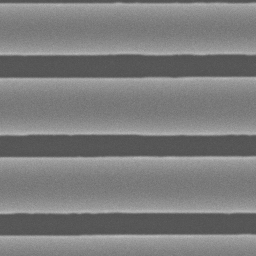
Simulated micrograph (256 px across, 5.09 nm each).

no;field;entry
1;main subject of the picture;lines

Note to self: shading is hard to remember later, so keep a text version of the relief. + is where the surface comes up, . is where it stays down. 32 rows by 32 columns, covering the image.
++++++++++++++++++++++++++++++++
++++++++++++++++++++++++++++++++
++++++++++++++++++++++++++++++++
++++++++++++++++++++++++++++++++
++++++++++++++++++++++++++++++++
++++++++++++++++++++++++++++++++
++++++++++++++++++++++++++++++++
................................
................................
................................
++++++++++++++++++++++++++++++++
++++++++++++++++++++++++++++++++
++++++++++++++++++++++++++++++++
++++++++++++++++++++++++++++++++
++++++++++++++++++++++++++++++++
++++++++++++++++++++++++++++++++
++++++++++++++++++++++++++++++++
................................
................................
................................
++++++++++++++++++++++++++++++++
++++++++++++++++++++++++++++++++
++++++++++++++++++++++++++++++++
++++++++++++++++++++++++++++++++
++++++++++++++++++++++++++++++++
++++++++++++++++++++++++++++++++
++++++++++++++++++++++++++++++++
................................
................................
..........++++++++++++++++++++++
++++++++++++++++++++++++++++++++
++++++++++++++++++++++++++++++++